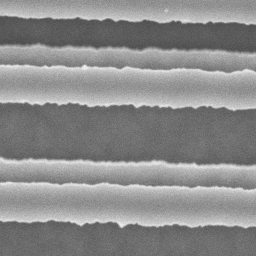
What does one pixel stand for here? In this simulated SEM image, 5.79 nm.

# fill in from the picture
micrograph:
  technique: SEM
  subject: lines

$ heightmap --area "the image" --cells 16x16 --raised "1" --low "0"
1111111111111111
0000000000000000
0000000000000000
1111111111111111
1111111111111111
1111111111111111
0000011111111111
0000000000000000
0000000000000000
0000000000000000
1111111111111111
1111111111111111
1111111111111111
1111111111111111
0000000000000000
0000000000000000